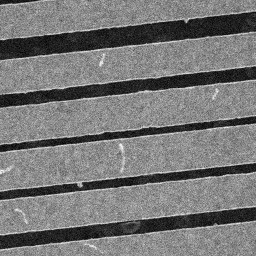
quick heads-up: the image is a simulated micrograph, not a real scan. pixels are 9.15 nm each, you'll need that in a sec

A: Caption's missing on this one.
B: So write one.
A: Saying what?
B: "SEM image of parallel lines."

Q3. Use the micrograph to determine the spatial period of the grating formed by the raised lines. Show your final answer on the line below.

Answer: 0.428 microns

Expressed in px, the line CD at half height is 34.5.